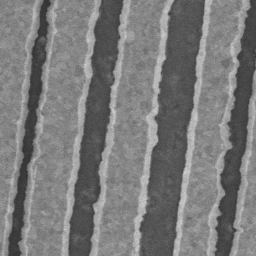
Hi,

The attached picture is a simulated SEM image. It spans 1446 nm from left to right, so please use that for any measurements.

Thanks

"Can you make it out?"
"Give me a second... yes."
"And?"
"one or a few lines or trenches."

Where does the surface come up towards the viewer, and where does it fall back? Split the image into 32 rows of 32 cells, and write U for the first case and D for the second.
UUUUUDDUUUUUDDDDUUUUUDDDDDUUUUUD
UUUUUDUUUUUUDDDDUUUUUDDDDDUUUUDD
UUUUDDUUUUUUDDDUUUUUDDDDDDUUUUDD
UUUUDDDUUUUDDDDUUUUUDDDDDDUUUUDD
UUUUDDUUUUUDDDDUUUUUUDDDDDUUUUDD
UUUUDDUUUUUDDDDUUUUUDDDDDUUUUDDD
UUUUDDUUUUUDDDDUUUUUDDDDDUUUUDDD
UUUUDDUUUUUDDDDUUUUUDDDDDUUUUUDD
UUUDDDUUUUUDDDDUUUUUDDDDDUUUUUDD
UUUDDDUUUUUDDDDUUUUUDDDDDUUUUDDD
UUUDDDUUUUUDDDUUUUUDDDDDDUUUUDDD
UUUDDDUUUUUDDDUUUUUUDDDDDUUUUDDD
UUUDDUUUUUDDDDUUUUUDDDDDDUUUUDDD
UUUDDUUUUUDDDDUUUUUDDDDDUUUUDDDU
UUUDDUUUUUDDDDUUUUUDDDDDUUUUDDDD
UUUDDUUUUUDDDDUUUUUDDDDDUUUUDDDU
UUUDDUUUUUDDDDUUUUUDDDDDUUUUDDDU
UUDDDUUUUUDDDDUUUUUDDDDDUUUUDDDU
UUDDDUUUUDDDDDUUUUUDDDDDUUUUDDDU
UUDDUUUUUDDDDUUUUUUDDDDDUUUUDDDU
UUDDUUUUUDDDDUUUUUDDDDDDUUUDDDDU
UUDDUUUUUDDDDUUUUUDDDDDUUUUDDDUU
UUDDUUUUUDDDDUUUUUDDDDDUUUUDDDDU
UUDDUUUUUDDDDUUUUUDDDDDUUUUUDDDU
UDDDUUUUUDDDDUUUUUDDDDDUUUUDDDUU
UDDDUUUUUDDDDUUUUUDDDDDUUUUDDDUU
UDDDUUUUUDDDUUUUUUDDDDDUUUUDDDUU
UDDUUUUUDDDDUUUUUDDDDDDUUUDDDDUU
UDDUUUUUDDDDUUUUUDDDDDUUUUUDDDUU
UDDUUUUUDDDDUUUUUDDDDDUUUUDDDDUU
UDDUUUUUDDDDUUUUUDDDDDUUUUDDDUUU
UDDUUUUUDDDDUUUUUDDDDDUUUUDDDUUU